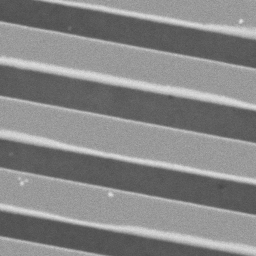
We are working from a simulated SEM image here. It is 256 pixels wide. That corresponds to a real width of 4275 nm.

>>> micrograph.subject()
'lines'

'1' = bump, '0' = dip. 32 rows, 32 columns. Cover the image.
00000000111111111111111111111111
00000000000000111111111111111111
00000000000000000001111111111111
11110000000000000000000001111111
11111111110000000000000000000001
11111111111111100000000000000000
11111111111111111111000000000000
11111111111111111111111111000000
00001111111111111111111111111110
00000000011111111111111111111111
00000000000000011111111111111111
00000000000000000000111111111111
11000000000000000000000000111111
11111111000000000000000000000001
11111111111110000000000000000000
11111111111111111110000000000000
11111111111111111111111100000000
00111111111111111111111111111000
00000001111111111111111111111111
00000000000011111111111111111111
00000000000000000011111111111111
11100000000000000000000011111111
11111111000000000000000000000111
11111111111110000000000000000000
11111111111111111110000000000000
11111111111111111111111100000000
00111111111111111111111111111000
00000001111111111111111111111111
00000000000001111111111111111111
00000000000000000001111111111111
11111000000000000000000011111111
11111111110000000000000000000011